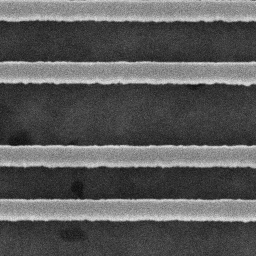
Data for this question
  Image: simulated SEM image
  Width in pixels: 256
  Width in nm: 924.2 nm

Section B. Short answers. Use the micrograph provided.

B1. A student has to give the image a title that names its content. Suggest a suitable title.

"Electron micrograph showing lines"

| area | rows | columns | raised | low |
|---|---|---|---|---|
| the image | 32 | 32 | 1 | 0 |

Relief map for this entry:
11111111111111111111111111111111
11111111111111111111111111111111
01100001100011111111111111101111
00000000000000000000000000000000
00000000000000000000000000000000
00000000000000000000000000000000
00000000000000000000000000000000
00000000000000000000000000000000
11111111111111111111111111111111
11111111111111111111111111111111
00000000000000000000000000000000
00000000000000000000000000000000
00000000000000000000000000000000
00000000000000000000000000000000
00000000000000000000000000000000
00000000000000000000000000000000
00000000000000000000000000000000
00000000000000000000000000000000
11111111111111111111111111111111
11111111111111111111111111111111
11111111111111111111111111111111
00000000000000000000000000000000
00000000000000000000000000000000
00000000000000000000000000000000
00000000000000000000000000000000
11111111111111111111111111111111
11111111111111111111111111111111
00000000000000000000000000001010
00000000000000000000000000000000
00000000000000000000000000000000
00000000000000000000000000000000
00000000000000000000000000000000